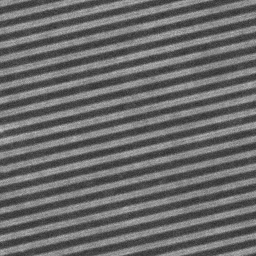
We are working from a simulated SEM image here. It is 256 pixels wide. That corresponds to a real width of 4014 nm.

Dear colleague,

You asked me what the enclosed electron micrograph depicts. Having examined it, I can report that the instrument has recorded parallel lines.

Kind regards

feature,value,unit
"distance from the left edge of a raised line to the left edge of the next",211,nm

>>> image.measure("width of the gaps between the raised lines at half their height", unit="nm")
138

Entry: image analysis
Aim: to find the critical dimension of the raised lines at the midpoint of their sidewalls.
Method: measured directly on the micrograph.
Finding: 0.0764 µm